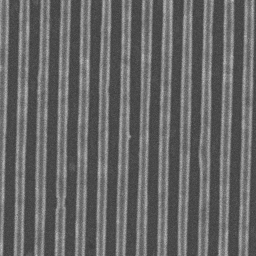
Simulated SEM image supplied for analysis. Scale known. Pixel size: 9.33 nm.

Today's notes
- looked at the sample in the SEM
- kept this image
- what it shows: parallel lines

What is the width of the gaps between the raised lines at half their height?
124 nm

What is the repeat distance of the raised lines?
191 nm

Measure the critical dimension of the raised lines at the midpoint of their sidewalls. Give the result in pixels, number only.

7.88